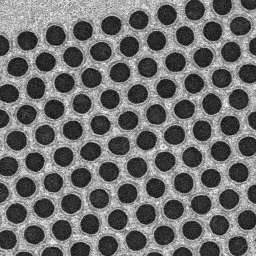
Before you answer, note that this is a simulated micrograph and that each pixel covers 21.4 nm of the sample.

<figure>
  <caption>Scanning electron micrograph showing a regular array of holes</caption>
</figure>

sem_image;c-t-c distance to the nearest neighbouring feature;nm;590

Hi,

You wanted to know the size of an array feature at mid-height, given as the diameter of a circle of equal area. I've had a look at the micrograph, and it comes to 20.6 pixels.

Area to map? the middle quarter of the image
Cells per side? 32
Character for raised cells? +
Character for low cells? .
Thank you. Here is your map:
+...++++++++....++.....++.....++
+++++...++++.....+.....+++....++
.+++.....++......++....+++++++++
..++......++....++++++++++++++..
...++....++++..+++++++++...+++..
...++....++++++++...+++.....++..
..+++++++++..+++.....++.....+++.
++++.++++.....++.....++.....++++
+++...+++.....++.....+++...+++++
++.....++.....+++...++++++++....
++.....+++...++++++++....+++....
++....+++++++++++++++....++.....
++++.+++++++++....++......++....
+++++++....+++.....++.....+++..+
+...+++....++......++....+++++++
....++......++....+++++++++..+++
.....++....++++..++++++++.....++
.....+++..+++++++++....++.....++
....++++++++....++.....++.....++
+++++++++++......+.....+++....++
+++++....++......+.....+++++++++
..++.....++.....++++.+++++++++..
...+.....+++....+++++++....+++..
...++....++++++++...+++.....++..
..++++++++..++++....+++.....++..
.++++++++....+++.....++....+++..
++....+++.....++.....+++...+++++
++.....++.....++....+++++++++..+
++.....++....+++++.+++.+++++....
++.....++++++++++++++....++.....
++....++++++++...++++....++.....
+++++++...+++.....++.....+++....